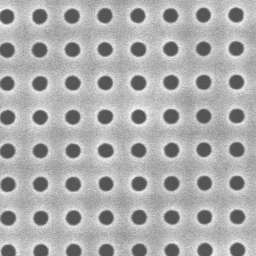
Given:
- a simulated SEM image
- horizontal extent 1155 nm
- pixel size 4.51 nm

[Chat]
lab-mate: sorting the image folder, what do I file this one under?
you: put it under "a regular array of holes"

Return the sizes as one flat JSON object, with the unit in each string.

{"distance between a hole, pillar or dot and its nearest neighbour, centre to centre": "146 nanometres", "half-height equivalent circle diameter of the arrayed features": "67.5 nanometers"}